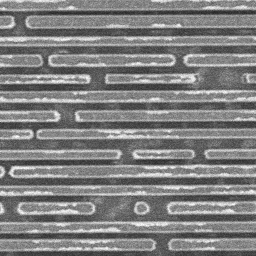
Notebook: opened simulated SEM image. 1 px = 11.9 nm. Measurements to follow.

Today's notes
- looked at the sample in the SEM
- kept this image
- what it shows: parallel lines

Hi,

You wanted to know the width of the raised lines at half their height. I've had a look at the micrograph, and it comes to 120 nanometers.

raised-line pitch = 220 nanometers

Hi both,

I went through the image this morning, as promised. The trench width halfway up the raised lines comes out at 0.0993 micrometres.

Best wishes